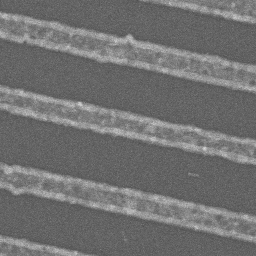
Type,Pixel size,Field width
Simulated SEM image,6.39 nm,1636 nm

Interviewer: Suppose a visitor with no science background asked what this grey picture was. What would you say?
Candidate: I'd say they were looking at one or a few lines or trenches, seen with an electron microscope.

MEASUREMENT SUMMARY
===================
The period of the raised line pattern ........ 469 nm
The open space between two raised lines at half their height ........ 342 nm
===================